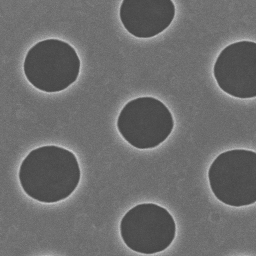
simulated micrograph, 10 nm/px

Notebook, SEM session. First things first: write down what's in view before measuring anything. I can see holes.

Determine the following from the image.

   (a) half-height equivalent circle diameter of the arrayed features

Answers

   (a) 538 nm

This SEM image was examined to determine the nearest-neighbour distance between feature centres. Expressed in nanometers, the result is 1080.